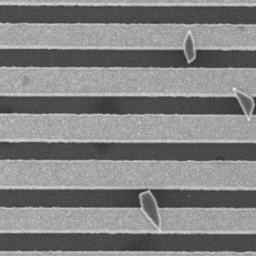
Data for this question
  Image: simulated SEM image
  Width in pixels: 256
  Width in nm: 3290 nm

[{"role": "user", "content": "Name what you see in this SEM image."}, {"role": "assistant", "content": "lines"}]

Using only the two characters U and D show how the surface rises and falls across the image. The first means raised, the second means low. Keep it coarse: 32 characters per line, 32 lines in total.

UUUUUUUUUUUUUUUUUUUUUUUUUUUUUUUU
DDDDDDDDDDDDDDDDDDDDDDDDDDDDDDDD
DDDDDDDDDDDDDDDDDDDDDDDDDDDDDDDD
UUUUUUUUUUUUUUUUUUUUUUUUUUUUUUUU
UUUUUUUUUUUUUUUUUUUUUUUUUUUUUUUU
UUUUUUUUUUUUUUUUUUUUUUUUUUUUUUUU
DDDDDDDDDDDDDDDDDDDDDDDUUDDDDDDD
DDDDDDDDDDDDDDDDDDDDDDDDDDDDDDDD
UUUUUUUUUUUUUUUUUUUDDUDDUUDDDDDD
UUUUUUUUUUUUUUUUUUUUUUUUUUUUUUUU
UUUUUUUUUUUUUUUUUUUUUUUUUUUUUUUU
UUUUUUUUUUUUUUUUUUUUUUUUUUUUUUUU
DDDDDDDDDDDDDDDDDDDDDDDDDDDDDDUU
DDDDDDDDDDDDDDDDDDDDDDDDDDDDDDUU
UUUUUUUUUUUUUUUUUUUUUUUUUUUUUUUU
UUUUUUUUUUUUUUUUUUUUUUUUUUUUUUUU
UUUUUUUUUUUUUUUUUUUUUUUUUUUUUUUU
UUUUUUUUUUUUUUUUUUUUUUUUUUUUUUUU
DDDDDDDDDDDDDDDDDDDDDDDDDDDDDDDD
DDDDDDDDDDDDDDDDDDDDDDDDDDDDDDDD
UUUUUUUUUUUUUUUUUUUUUUUUUUUUUUUU
UUUUUUUUUUUUUUUUUUUUUUUUUUUUUUUU
UUUUUUUUUUUUUUUUUUUUUUUUUUUUUUUU
UDDUUUUDUUUUUUUUUUUUUUUUUUUUUUUU
DDDDDDDDDDDDDDDDDUUDDDDDDDDDDDDD
DDDDDDDDDDDDDDDDDDUUDDDDDDDDDDDD
UUUUUUUUUUUUUUUUUUUUUUUUUUUUUUUU
UUUUUUUUUUUUUUUUUUUUUUUUUUUUUUUU
UUUUUUUUUUUUUUUUUUUUUUUUUUUUUUUU
DDDDDDDDDDDDDDDDDDDDDDDDDDDDDDDD
DDDDDDDDDDDDDDDDDDDDDDDDDDDDDDDD
UUUUUUUUUUUUUUUUUUUUUUUUUUUUUDUU